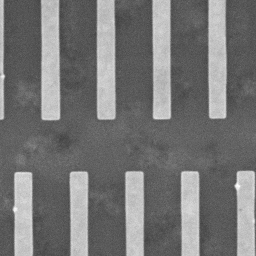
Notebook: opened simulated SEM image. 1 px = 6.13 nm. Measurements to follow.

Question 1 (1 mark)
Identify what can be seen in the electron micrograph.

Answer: groups of lines, slits or small figures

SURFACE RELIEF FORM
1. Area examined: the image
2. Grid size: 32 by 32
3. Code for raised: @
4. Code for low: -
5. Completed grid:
-----@@-----@@-----@@-----@@----
-----@@-----@@-----@@-----@@----
-----@@-----@@-----@@-----@@----
-----@@-----@@-----@@-----@@----
-----@@-----@@-----@@-----@@----
-----@@-----@@-----@@-----@@----
-----@@-----@@-----@@-----@@----
-----@@-----@@-----@@-----@@----
-----@@-----@@-----@@-----@@----
-----@@-----@@-----@@-----@@----
-----@@-----@@-----@@-----@@----
-----@@-----@@-----@@-----@@----
-----@@-----@@-----@@-----@@----
-----@@-----@@-----@@-----@@----
-----@@-----@@-----@@-----@@----
--------------------------------
--------------------------------
--------------------------------
--------------------------------
--------------------------------
--------------------------------
------------------------------@@
--@@-----@@-----@@-----@@-----@@
--@@-----@@-----@@-----@@-----@@
--@@-----@@-----@@-----@@-----@@
--@@-----@@-----@@-----@@-----@@
--@@-----@@-----@@-----@@-----@@
--@@-----@@-----@@-----@@-----@@
--@@-----@@-----@@-----@@-----@@
--@@-----@@-----@@-----@@-----@@
--@@-----@@-----@@-----@@-----@@
--@@-----@@-----@@-----@@-----@@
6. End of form